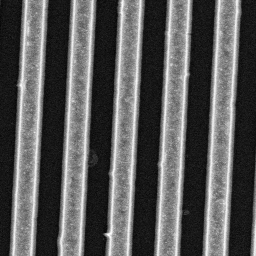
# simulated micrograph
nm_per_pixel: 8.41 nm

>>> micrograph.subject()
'parallel lines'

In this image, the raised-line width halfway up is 184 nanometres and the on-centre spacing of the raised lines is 405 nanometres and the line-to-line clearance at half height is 0.221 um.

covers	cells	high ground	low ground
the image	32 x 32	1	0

00011100011100011100011100011100
00011100011100011100011100011100
00011100011100011100011100011100
00011100011100011100011100011100
00011100011100011100011100011100
00011000011000011000011100011100
00011000011000011000011100011100
00011000011000011000011100011100
00011000011000011000011000011000
00011000011000011000011000011000
00111000011000011000011000011000
00111000011000011000011000011000
00111000111000111000111000011000
00111000111000111000111000011000
00111000111000111000111000111000
00111000111000111000111000111000
00111000111000111000111000111000
00111000111000111000111000111000
00111000111000111000111000111000
00111000111000111000111000111000
00111000111000111000111000111000
00111000111000111000111000111000
00111000111000111000111000111000
00111000111000111000111000111000
00110000111000111000111000111000
00110000110000110000110000110000
00110000110000110000110000111000
00110000110000110000110000110000
00110000110000110000110000110000
00110000110001110000110000110000
00110001110000110000110000110000
01110001110000110000110000110000